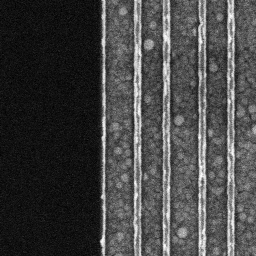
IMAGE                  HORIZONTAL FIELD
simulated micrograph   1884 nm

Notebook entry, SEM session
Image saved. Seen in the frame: parallel lines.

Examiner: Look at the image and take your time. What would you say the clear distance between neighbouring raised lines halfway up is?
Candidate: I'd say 193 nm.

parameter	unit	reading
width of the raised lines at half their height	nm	46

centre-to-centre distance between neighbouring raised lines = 229 nm